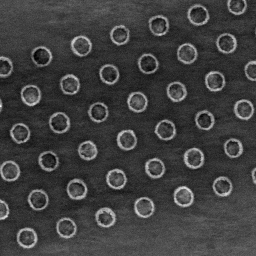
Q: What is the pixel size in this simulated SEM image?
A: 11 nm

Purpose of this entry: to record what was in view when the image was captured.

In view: a regular array of raised bodies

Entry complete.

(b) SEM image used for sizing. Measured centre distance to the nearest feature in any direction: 436 nm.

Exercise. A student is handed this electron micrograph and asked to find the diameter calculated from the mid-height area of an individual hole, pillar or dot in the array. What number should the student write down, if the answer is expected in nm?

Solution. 209